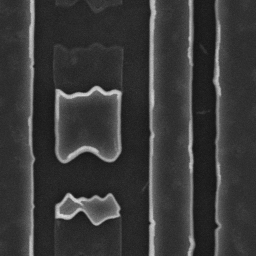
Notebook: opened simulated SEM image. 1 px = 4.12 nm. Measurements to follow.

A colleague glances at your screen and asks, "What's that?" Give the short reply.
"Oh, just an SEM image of one or a few lines or trenches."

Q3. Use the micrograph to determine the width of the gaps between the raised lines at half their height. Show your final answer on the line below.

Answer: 102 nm